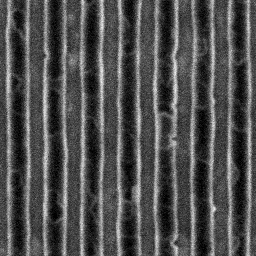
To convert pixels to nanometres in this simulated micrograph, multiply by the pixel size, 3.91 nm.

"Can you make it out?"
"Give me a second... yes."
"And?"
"parallel lines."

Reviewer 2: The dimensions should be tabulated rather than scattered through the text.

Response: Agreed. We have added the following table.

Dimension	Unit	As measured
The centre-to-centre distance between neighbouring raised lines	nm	144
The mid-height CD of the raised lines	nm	83.7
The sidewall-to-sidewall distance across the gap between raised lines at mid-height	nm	62.1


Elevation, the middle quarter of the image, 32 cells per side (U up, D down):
DDDDUUUUUDDDDDUUUUUDDDDUUUUUDDDD
DDDDUUUUUDDDDDUUUUUDDDDUUUUUDDDD
DDDDUUUUUDDDDDUUUUUDDDDUUUUUDDDD
DDDDUUUUUDDDDDUUUUUDDDDUUUUUDDDD
DDDDUUUUUDDDDDUUUUUDDDDUUUUUDDDD
DDDDUUUUUDDDDDUUUUUDDDDUUUUUDDDD
DDDDDUUUUDDDDDUUUUUDDDDUUUUUDDDD
DDDDDUUUUDDDDDUUUUUDDDDUUUUUDDDD
DDDDDUUUUDDDDDUUUUUDDDDUUUUUDDDD
DDDDDUUUUDDDDUUUUUUDDDDUUUUUDDDD
DDDDDUUUUDDDDDUUUUUDDDUUUUUUDDDD
DDDDDUUUUDDDDDUUUUUDDDDUUUUUDDDD
DDDDDUUUUDDDDDUUUUUDDDDUUUUUDDDD
DDDDDUUUUDDDDDUUUUUDDDDUUUUUDDDD
DDDDDUUUUUDDDDUUUUUDDDDUUUUUDDDD
DDDDDUUUUUDDDDUUUUUDDDDUUUUUDDDD
DDDDDUUUUUDDDDUUUUUDDDDUUUUUDDDD
DDDDDUUUUUDDDDUUUUUDDDDUUUUUDDDD
DDDDDUUUUUDDDDUUUUUDDDDUUUUDDDDD
DDDDDUUUUUDDDDUUUUUDDDDUUUUUDDDD
UDDDDUUUUUDDDDUUUUUDDDDUUUUUDDDD
UDDDDUUUUUDDDDUUUUUDDDDUUUUUDDDD
UDDDDUUUUUDDDDUUUUUDDDDUUUUUDDDD
UDDDDUUUUUDDDDUUUUUDDDDUUUUUDDDD
UDDDDUUUUUDDDDUUUUUDDDDUUUUUDDDD
UDDDDUUUUUDDDDUUUUUDDDDUUUUUDDDD
DDDDDUUUUDDDDDUUUUUDDDDUUUUUDDDD
DDDDDUUUUDDDDDUUUUUDDDDUUUUUDDDD
DDDDDUUUUDDDDDUUUUUDDDDUUUUUDDDD
DDDDDUUUUDDDDDUUUUUDDDDUUUUUDDDD
DDDDDUUUUDDDDDUUUUUDDDDUUUUUDDDD
DDDDDUUUUDDDDDUUUUUDDDDUUUUUDDDD